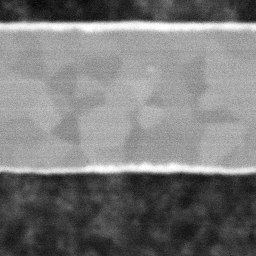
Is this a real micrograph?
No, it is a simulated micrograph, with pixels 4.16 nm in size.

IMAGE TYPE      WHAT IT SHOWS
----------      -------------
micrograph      one or a few lines or trenches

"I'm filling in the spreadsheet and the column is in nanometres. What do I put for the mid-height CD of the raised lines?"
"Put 605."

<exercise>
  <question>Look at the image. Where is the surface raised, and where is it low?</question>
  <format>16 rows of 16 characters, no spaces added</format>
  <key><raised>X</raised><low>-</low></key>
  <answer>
----------------
--------X-------
XXXXXXXXXXXXXXXX
XXXXXXXXXXXXXXXX
XXXXXXXXXXXXXXXX
XXXXXXXXXXXXXXXX
XXXXXXXXXXXXXXXX
XXXXXXXXXXXXXXXX
XXXXXXXXXXXXXXXX
XXXXXXXXXXXXXXXX
XXXXXXXXXXXXXXXX
----------------
----------------
----------------
----------------
----------------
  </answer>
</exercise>